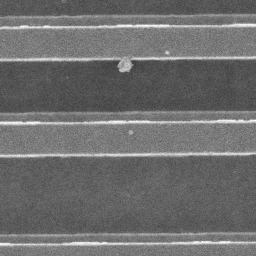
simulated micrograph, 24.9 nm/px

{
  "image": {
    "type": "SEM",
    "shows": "lines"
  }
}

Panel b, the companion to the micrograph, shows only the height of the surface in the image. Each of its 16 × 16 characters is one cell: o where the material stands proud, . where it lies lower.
................
oooooooooooooooo
oooooooooooooooo
oooooooooooooooo
................
................
................
oooooooooooooooo
oooooooooooooooo
oooooooooooooooo
................
................
................
................
................
oooooooooooooooo